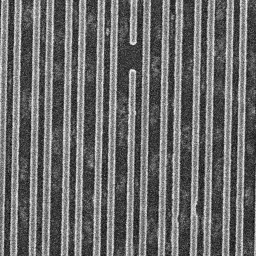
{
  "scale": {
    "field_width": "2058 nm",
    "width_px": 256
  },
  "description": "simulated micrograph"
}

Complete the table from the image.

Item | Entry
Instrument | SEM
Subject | parallel lines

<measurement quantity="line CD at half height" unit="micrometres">0.0472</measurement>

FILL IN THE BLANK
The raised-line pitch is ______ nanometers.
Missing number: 129